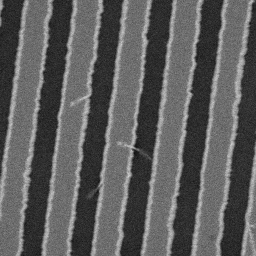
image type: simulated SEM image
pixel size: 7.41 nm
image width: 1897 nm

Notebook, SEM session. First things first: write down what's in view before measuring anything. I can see lines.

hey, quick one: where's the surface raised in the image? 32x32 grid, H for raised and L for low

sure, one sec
LLLHHHLLLHHHHLLHHHHLLLHHHLLLHHHH
LLLHHHLLLHHHHLLHHHHLLHHHHLLLHHHL
LLLHHHLLLHHHHLLHHHHLLHHHHLLLHHHL
LLLHHHLLLHHHLLLHHHLLLHHHHLLLHHHL
LLLHHHLLLHHHLLLHHHLLLHHHHLLHHHHL
LLHHHHLLHHHHLLLHHHLLLHHHLLLHHHHL
LLHHHHLLHHHHLLLHHHLLLHHHLLLHHHHL
LLHHHHLLHHHHLLLHHHLLLHHHLLLHHHLL
LLHHHLLLHHHHLLHHHHLLLHHHLLLHHHLL
LLHHHLLLHHHLLLHHHHLLHHHHLLLHHHLL
LLHHHLLLHHHLLLHHHHLLHHHHLLLHHHLL
LLHHHLLLHHHLLLHHHHLLHHHHLLHHHHLL
LLHHHLLLHHHLLLHHHLLLHHHHLLHHHHLL
LHHHHLLHHHHLLLHHHLLLHHHLLLHHHHLL
LHHHHLLHHHHLLLHHHLLLHHHLLLHHHHLL
LHHHLLLHHHHLLLHHHLLLHHHLLLHHHHLL
LHHHLLLHHHHLLHHHHLLLHHHLLLHHHHLL
LHHHLLLHHHLLLHHHHLLLHHHLLLHHHLLL
LHHHLLLHHHLLLHHHHLLHHHHLLLHHHLLL
LHHHLLLHHHLLLHHHHLLHHHHLLHHHHLLL
HHHHLLLHHHLLLHHHLLLHHHHLLHHHHLLL
HHHHLLHHHHLLLHHHLLLHHHHLLHHHHLLL
HHHHLLHHHHLLLHHHLLLHHHLLLHHHHLLH
HHHLLLHHHHLLHHHHLLLHHHLLLHHHHLLH
HHHLLLHHHHLLHHHHLLLHHHLLLHHHLLLH
HHHLLLHHHLLLHHHHLLLHHHLLLHHHLLLH
HHHLLLHHHLLLHHHHLLHHHHLLLHHHLLLH
HHHLLLHHHLLLHHHLLLHHHHLLLHHHLLLH
HHHLLLHHHLLLHHHLLLHHHLLLHHHHLLLH
HHHLLHHHHLLLHHHLLLHHHHLLHHHHLLHH
HHHLLHHHHLLLHHHLLLHHHLLLHHHLLLHH
HHHLLHHHHLLHHHHLLLHHHLLLHHHHLLHH